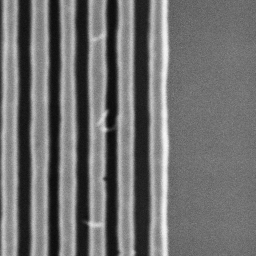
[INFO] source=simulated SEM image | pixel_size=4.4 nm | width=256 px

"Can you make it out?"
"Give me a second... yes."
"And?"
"parallel lines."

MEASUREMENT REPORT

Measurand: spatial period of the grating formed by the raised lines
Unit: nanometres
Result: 130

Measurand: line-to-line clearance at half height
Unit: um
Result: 0.0605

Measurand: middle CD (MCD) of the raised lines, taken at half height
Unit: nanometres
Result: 68.2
